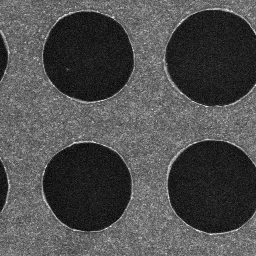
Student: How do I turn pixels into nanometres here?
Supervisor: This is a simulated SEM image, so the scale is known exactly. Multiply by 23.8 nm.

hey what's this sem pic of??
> holes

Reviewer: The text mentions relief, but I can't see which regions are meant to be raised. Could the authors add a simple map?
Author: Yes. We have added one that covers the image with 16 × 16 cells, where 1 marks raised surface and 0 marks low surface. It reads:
1111111111111111
1111000111100000
1110000011100000
1110000011000000
1110000011000000
1111000011100000
1111111111111011
1111111111111111
1111111111111111
1111000111100001
1110000011100000
1110000011100000
1110000011100000
1111000011100000
1111111111111011
1111111111111111